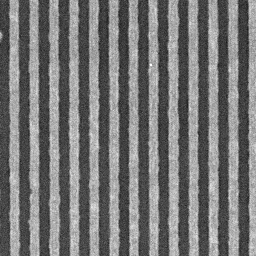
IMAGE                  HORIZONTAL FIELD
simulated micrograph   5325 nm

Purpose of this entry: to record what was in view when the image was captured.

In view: parallel lines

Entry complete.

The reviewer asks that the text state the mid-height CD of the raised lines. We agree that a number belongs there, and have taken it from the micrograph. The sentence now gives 166 nanometers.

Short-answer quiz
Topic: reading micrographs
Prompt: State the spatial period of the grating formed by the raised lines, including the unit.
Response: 414 nanometers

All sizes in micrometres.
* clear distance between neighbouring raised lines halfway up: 0.247